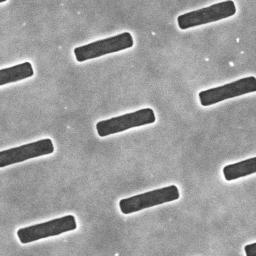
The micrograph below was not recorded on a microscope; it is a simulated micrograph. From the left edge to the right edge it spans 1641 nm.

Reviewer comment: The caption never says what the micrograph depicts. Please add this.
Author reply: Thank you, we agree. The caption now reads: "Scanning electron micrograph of holes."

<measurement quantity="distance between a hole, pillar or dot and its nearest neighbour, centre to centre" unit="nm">509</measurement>